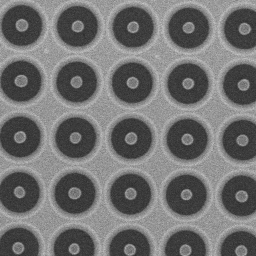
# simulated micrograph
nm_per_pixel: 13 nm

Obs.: an array of small figures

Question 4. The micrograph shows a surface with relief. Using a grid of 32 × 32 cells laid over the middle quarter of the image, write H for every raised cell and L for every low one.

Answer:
LLLLLLLLHHHHHLLLLLLLLHHHHHHLLLLL
LLLLLLLLHHHHLLLLLLLLLLHHHHLLLLLL
LLLLLLLLLHHHLLLLLLLLLLLHHHLLLLLL
LLHHLLLLLHHLLLLLLHLLLLLHHLLLLLLL
LLHHLLLLLHHLLLLLHHHLLLLHHLLLLLHH
LLHHLLLLLHHLLLLLHHLLLLLHHLLLLLHH
LLLLLLLLLHHHLLLLLLLLLLLHHLLLLLLL
LLLLLLLLHHHHLLLLLLLLLLHHHHLLLLLL
LLLLLLLHHHHHHLLLLLLLLLHHHHLLLLLL
LLLLLLHHHHHHHHLLLLLLLHHHHHHLLLLL
HHHLHHHHHHHHHHHHLLLHHHHHHHHHHLLL
HHHHHHHHHHHHHHHHHHHHHHHHHHHHHHHH
HHHHHHHHHHHHHHHHHHHHHHHHHHHHHHHH
LLLLLLHHHHHHHHLLLLLHHHHHHHHHLLLL
LLLLLLLHHHHHHLLLLLLLLHHHHHHLLLLL
LLLLLLLLHHHHLLLLLLLLLLHHHHLLLLLL
LLLLLLLLLHHLLLLLLLLLLLHHHLLLLLLL
LLHHLLLLLHHLLLLLHHLLLLLHHLLLLLHL
LLHHLLLLLHHLLLLHHHLLLLLHHLLLLLHH
LLHHLLLLLHHLLLLLHHLLLLLHHLLLLLHH
LLLLLLLLHHHLLLLLLLLLLLHHHLLLLLLL
LLLLLLLLHHHHLLLLLLLLLLHHHHLLLLLL
LLLLLLLHHHHHLLLLLLLLLHHHHHLLLLLL
LLLLLLHHHHHHHHLLLLLLHHHHHHHLLLLL
HHHHHHHHHHHHHHHHLHHHHHHHHHHHHLLL
HHHHHHHHHHHHHHHHHHHHHHHHHHHHHHHH
HHLLHHHHHHHHHHHHHHHHHHHHHHHHHHHH
LLLLLLHHHHHHHHLLLLLLHHHHHHHHLLLL
LLLLLLLHHHHHHLLLLLLLLHHHHHHLLLLL
LLLLLLLLHHHHLLLLLLLLLLHHHHLLLLLL
LLLLLLLLHHHLLLLLLLLLLLHHHLLLLLLL
LHHHLLLLLHHLLLLLHHLLLLHHHLLLLLHL